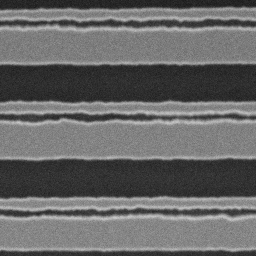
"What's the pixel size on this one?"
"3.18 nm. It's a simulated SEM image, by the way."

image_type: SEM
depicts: lines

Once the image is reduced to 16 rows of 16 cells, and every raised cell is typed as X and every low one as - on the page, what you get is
----------------
XXXXXXXXXXXXXXXX
XXXXXXXXXXXXXXXX
XXXXXXXXXXXXXXXX
----------------
----------------
XXXXXXXXXXXXXXXX
XXXXXXXXXXXXXXXX
XXXXXXXXXXXXXXXX
XXXXXXXXXXXXXXXX
----------------
----------------
XXXXXXXXXXXXXXXX
XXXXXXXXXXXXXXXX
XXXXXXXXXXXXXXXX
XXXXXXXXXXXXXXXX